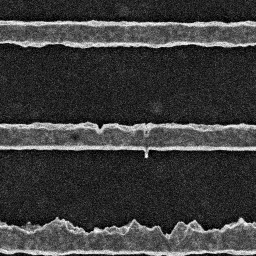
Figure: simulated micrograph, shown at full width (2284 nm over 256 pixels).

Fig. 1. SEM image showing one or a few lines or trenches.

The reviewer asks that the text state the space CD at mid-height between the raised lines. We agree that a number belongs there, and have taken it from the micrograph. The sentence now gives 720 nm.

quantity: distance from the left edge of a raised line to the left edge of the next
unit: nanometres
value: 919